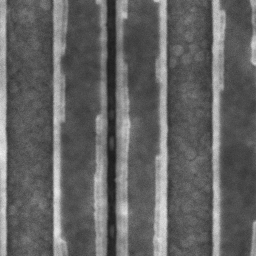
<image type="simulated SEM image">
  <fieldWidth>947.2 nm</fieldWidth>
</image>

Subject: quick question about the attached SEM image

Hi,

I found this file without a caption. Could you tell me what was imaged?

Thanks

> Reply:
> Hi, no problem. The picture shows one or a few lines or trenches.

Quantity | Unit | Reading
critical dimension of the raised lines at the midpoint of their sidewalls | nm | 175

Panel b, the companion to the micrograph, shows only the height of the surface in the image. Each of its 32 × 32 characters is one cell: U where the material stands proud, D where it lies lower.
DDDDDDDUUUUUUDDUUUUUDDDDDDDUUUUU
DDDDDDDUUUUUUDDUUUUUDDDDDDDUUUUU
DDDDDDDUUUUUUDDUUUUUDDDDDDDUUUUU
DDDDDDDUUUUUUDDUUUUUDDDDDDDUUUUU
DDDDDDDUUUUUUDDUUUUUDDDDDDDUUUUU
DDDDDDDUUUUUUDDUUUUUDDDDDDDUUUUU
DDDDDDDUUUUUUDDUUUUUDDDDDDDUUUUU
DDDDDDDUUUUUUDDUUUUUDDDDDDDUUUUU
DDDDDDDUUUUUUDDUUUUUDDDDDDDUUUUU
DDDDDDDUUUUUUDDUUUUUDDDDDDDUUUUU
DDDDDDDUUUUUUDDUUUUUDDDDDDDUUUUU
DDDDDDDUUUUUUDDUUUUUDDDDDDDUUUUU
DDDDDDDUUUUUUDDUUUUUDDDDDDDUUUUU
DDDDDDDUUUUUUDDUUUUUDDDDDDDUUUUU
DDDDDDDUUUUUUDDUUUUUDDDDDDDUUUUU
DDDDDDDUUUUUUDDUUUUUDDDDDDDUUUUU
DDDDDDDUUUUUUDDUUUUUDDDDDDDUUUUU
DDDDDDDUUUUUUDDUUUUUDDDDDDDUUUUU
DDDDDDDUUUUUUDDUUUUUDDDDDDDUUUUU
DDDDDDDUUUUUUDDUUUUUDDDDDDDUUUUU
DDDDDDDUUUUUUDDUUUUUDDDDDDDUUUUU
DDDDDDDUUUUUUDDUUUUUDDDDDDDUUUUU
DDDDDDDUUUUUUDDUUUUUDDDDDDDUUUUU
DDDDDDDUUUUUUDDUUUUUDDDDDDDUUUUU
DDDDDDDUUUUUUDDUUUUUDDDDDDDUUUUU
DDDDDDDUUUUUUDDUUUUUDDDDDDDUUUUU
DDDDDDDUUUUUUDDUUUUUDDDDDDDUUUUU
DDDDDDDUUUUUUDDUUUUUDDDDDDDUUUUU
DDDDDDDUUUUUUDDUUUUUDDDDDDDUUUUU
DDDDDDDUUUUUUDDUUUUUDDDDDDDUUUUU
DDDDDDDUUUUUUDDUUUUUDDDDDDDUUUUU
DDDDDDDUUUUUUDDUUUUUDDDDDDDUUUUU